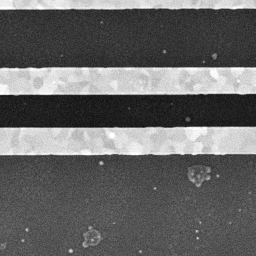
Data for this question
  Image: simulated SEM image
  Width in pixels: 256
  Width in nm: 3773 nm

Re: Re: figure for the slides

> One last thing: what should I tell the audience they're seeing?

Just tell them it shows lines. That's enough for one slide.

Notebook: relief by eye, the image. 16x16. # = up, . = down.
########..##.##.
................
................
................
################
################
................
................
################
################
................
................
................
................
................
................